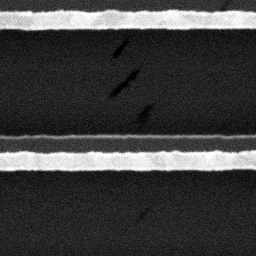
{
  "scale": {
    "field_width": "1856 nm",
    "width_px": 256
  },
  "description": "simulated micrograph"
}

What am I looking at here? lines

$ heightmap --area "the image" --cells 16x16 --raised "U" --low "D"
UUUUUUUUUUUUUUUU
UUUUUUUUUUUUUUUU
DDDDDDDDDDDDDDDD
DDDDDDDDDDDDDDDD
DDDDDDDDDDDDDDDD
DDDDDDDDDDDDDDDD
DDDDDDDDDDDDDDDD
DDDDDDDDDDDDDDDD
DDDDDDDDDDDDDDDD
UUUUUUUUUUUUUUUU
UUUUUUUUUUUUUUUU
DDDDDDDDDDDDDDDD
DDDDDDDDDDDDDDDD
DDDDDDDDDDDDDDDD
DDDDDDDDDDDDDDDD
DDDDDDDDDDDDDDDD